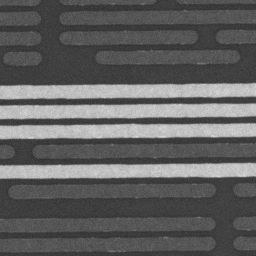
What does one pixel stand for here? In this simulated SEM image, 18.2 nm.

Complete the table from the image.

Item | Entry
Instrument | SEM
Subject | groups of lines, slits or small figures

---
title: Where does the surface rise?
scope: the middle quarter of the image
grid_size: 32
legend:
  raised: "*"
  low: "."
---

................................
................................
................................
................................
................................
..******************************
********************************
********************************
................................
................................
**.*****************************
********************************
********************************
................................
................................
..******************************
********************************
********************************
................................
................................
********************************
********************************
********************************
................................
................................
********************************
********************************
********************************
................................
................................
********************************
********************************